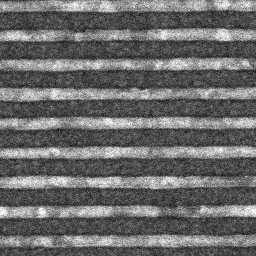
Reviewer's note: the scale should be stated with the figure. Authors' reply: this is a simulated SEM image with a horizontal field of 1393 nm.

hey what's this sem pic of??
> parallel lines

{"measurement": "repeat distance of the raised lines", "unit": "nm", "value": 160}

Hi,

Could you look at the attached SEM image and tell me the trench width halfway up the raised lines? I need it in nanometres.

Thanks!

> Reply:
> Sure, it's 107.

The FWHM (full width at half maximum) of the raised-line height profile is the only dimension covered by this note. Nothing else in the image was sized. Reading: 53.7 nm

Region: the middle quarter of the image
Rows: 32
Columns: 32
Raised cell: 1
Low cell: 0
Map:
11111111111111111111111111111111
00000000000000000000000000000000
00000000000000000000000000000000
00000000000000000000000000000000
00000000000000000000000000000000
00000000000000000000000000000000
11111111100000111110011111111111
11111111111111111111111111111111
11111111111111111111111111110000
00000000000000000000000000000000
00000000000000000000000000000000
00000000000000000000000000000000
00000000000000000000000000000000
00000000000000000000000000011100
11111111111111111111111111111111
11111111111111111111111111111111
00000000000000000000000000000000
00000000000000000000000000000000
00000000000000000000000000000000
00000000000000000000000000000000
00000000000000000000000000000000
11111111111111111111111111111111
11111111111111111111111111111111
11111110000000000000000000000000
00000000000000000000000000000000
00000000000000000000000000000000
00000000000000000000000000000000
00000000000000000000000000000000
11111110000001111111111111111111
11111111111111111111111111111111
00000000111111111111111111111111
00000000000000000000000000000000